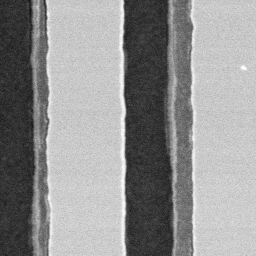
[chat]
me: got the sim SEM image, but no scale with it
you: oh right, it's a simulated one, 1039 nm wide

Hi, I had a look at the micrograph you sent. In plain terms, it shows lines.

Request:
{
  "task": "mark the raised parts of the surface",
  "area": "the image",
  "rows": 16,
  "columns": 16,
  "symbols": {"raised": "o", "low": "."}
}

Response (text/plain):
..oooooo...ooooo
..oooooo...ooooo
..oooooo...ooooo
..oooooo...ooooo
..oooooo...ooooo
..oooooo...ooooo
..oooooo....oooo
..oooooo...ooooo
..oooooo....oooo
..oooooo....oooo
..oooooo...ooooo
..oooooo...ooooo
...ooooo...ooooo
...ooooo...ooooo
..oooooo...ooooo
..oooooo...ooooo